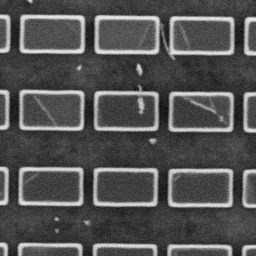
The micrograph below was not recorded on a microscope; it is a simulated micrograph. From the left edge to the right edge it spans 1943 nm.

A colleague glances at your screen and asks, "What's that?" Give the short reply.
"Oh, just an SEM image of wiring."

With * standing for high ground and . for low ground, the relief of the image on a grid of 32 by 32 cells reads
................................
................................
*..*******..*******...*******..*
*..*******..********..*******..*
*..*******..********..*******..*
*..*******..********..*******..*
..............**.**...*******..*
................................
................................
................................
................................
................................
*..*******..********.********..*
*..*******..********.********..*
*..*******..********.********..*
*..*******..********.********..*
................................
................................
................................
................................
................................
*..*******..*******...*******..*
*..*******..*******..********..*
*..*******..*******..********..*
*..*******..*******..********..*
..............*.......******...*
................................
................................
................................
................................
................................
*.********..*******..********..*